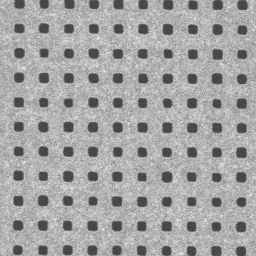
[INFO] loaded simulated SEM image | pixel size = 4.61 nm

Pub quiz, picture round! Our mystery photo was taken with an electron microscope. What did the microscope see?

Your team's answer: a regular array of holes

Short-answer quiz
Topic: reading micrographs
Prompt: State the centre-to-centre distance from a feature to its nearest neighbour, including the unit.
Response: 24.4 px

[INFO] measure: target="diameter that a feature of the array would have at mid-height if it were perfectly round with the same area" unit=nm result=50.2